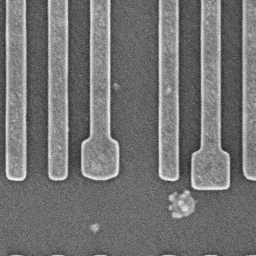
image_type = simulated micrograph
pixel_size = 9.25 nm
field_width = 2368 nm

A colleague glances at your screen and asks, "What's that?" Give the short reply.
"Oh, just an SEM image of wiring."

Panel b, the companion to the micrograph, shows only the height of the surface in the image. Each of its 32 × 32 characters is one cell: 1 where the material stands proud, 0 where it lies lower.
01100011000111000000110001100011
01100011000111000000110001100011
01100011000111000000110001100011
01100011000111000000110001100011
01100011000111000000110001100011
01100011000111000000110001100011
01100011000111000000110001100011
01100011000111000000110001100011
01100011000111000000110001100011
01100011000111000000110001100011
01100011000111000000110001100011
01100011000111000000110001100011
01100011000111000000110001100011
01100011000111000000110001100011
01100011000111000000110001100011
01100011000111000000110001100011
01100011000111000000110001100011
01100011000111000000110001100011
01100011001111100000110001110011
01100011001111100000110011111011
01100011001111100000110011111011
01100011001111100000110011111001
00000000000000000000010011111000
00000000000000000000000011110000
00000000000000000000000000000000
00000000000000000000000000000000
00000000000000000000000000000000
00000000000000000000000000000000
00000000000000000000000000000000
00000000000000000000000000000000
00000000000000000000000000000000
00000000000000000000000000000000